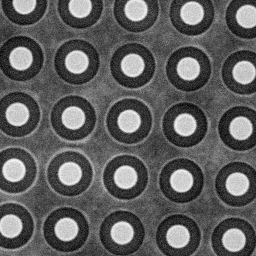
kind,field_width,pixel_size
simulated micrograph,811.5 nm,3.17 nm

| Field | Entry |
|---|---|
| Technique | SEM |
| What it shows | an array of small figures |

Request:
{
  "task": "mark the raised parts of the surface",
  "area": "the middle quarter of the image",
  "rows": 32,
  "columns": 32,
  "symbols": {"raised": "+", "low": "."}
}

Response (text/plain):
.+++++...++...++++++...++...++++
.++++....++....+++++...++...++++
........++++...++++....++....+++
.......+++++..........++++...+++
......+++++++........+++++......
++++++++++++++......+++++++.....
+++++++++++++++++++++++++++++...
++++++++++++++++++++++++++++++++
.....++++++++++..+++++++++++++++
......+++++++.......++++++++++.+
.......+++++.........++++++.....
++++....+++...........++++......
+++++...+++...++++....+++.......
+++++...++....+++++...+++....+++
+++++...++....+++++...++....++++
++++....+++...+++++...++....++++
........+++....+++....+++...++++
.......++++..........++++....++.
.....+++++++.........++++.......
+++++..++++++......+++++++......
.......+++++++++++++++++++++....
+.++++++++++++++++++++++++++++++
.....++++++++++.++++++++++++++++
......++++++.......+++++++++...+
.......++++.........++++++......
++++...+++..........+++++.......
++++...+++...+++++...+++........
++++...+++...+++++...+++...++++.
++++...+++...+++++...+++...+++++
+++....+++...+++++...+++...+++++
......++++....+++....+++...+++++
......+++++.........++++....+++.